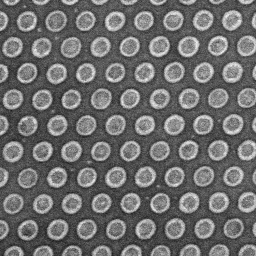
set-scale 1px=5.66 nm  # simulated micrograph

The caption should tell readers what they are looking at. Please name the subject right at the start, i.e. a regular array of raised bodies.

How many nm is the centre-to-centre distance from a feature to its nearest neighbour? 165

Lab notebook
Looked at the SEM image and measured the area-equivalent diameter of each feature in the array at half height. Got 0.104 micrometres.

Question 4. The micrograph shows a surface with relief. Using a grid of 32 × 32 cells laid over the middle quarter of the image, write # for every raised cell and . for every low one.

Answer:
....###.....##.....###....###...
...####....####...####...#####..
...####....####...####...#####..
...####....###....####....###...
................................
................................
........................#......#
####....####...###....####...###
####...#####..#####...####...###
####...####...####....####...###
###.....###....###.....##.....##
................................
................................
.....##.....###....###.....##...
....####...####...####....####..
...#####...####...####...#####..
...####....####...####....###...
....##..........................
................................
...............................#
####....###....####...####...###
####...####...#####...####...###
####...####...#####...####...###
###....####....###.....##.....##
................................
................................
.....##.....###....###.....##...
....####...####...#####...####..
....####...####...#####..#####..
....###....####...####....###...
............#...................
................................